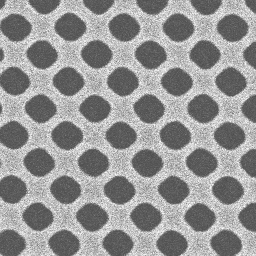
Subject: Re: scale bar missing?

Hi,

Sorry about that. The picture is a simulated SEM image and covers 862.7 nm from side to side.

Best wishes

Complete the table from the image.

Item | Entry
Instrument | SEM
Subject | a regular array of holes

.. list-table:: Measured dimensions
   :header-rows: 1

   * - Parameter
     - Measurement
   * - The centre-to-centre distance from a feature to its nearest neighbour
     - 127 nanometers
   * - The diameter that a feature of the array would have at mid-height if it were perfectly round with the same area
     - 98.3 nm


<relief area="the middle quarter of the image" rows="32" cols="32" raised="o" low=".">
oooooo....oooooooooo....oooooooo
...oooooooooo...oooooooooo....oo
....oooooooo......ooooooo......o
.....oooooo.......oooooo........
.....oooooo........ooooo........
.....oooooo........ooooo........
....oooooooo......ooooooo......o
...oooooooooo....ooooooooo....oo
oooooo....ooooooooo....ooooooooo
ooooo......ooooooo......ooooooo.
oooo........ooooo........oooooo.
oooo........ooooo........oooooo.
oooo.......ooooooo.......oooooo.
ooooo......oooooooo.....oooooooo
.oooooo..oooo..ooooo...oooo..ooo
...ooooooooo.....oooooooo.....oo
....ooooooo.......oooooo.......o
.....ooooo........oooooo........
.....ooooo........oooooo........
....ooooooo.......oooooo.......o
...ooooooooo.....ooooooooo....oo
.ooooo...oooooooooo...ooooo.oooo
oooo......oooooooo.....oooooooo.
oooo.......oooooo.......ooooooo.
ooo........oooooo........ooooo..
oooo.......oooooo........oooooo.
oooo.......ooooooo......oooooooo
ooooo.....ooooooooo....ooooooooo
..oooooooooo....oooooooooo...ooo
...oooooooo.....oooooooo......oo
....oooooo.......ooooooo.......o
....oooooo........ooooo........o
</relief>